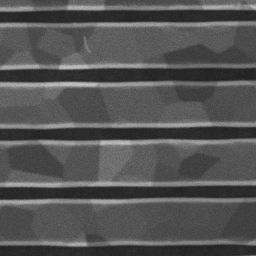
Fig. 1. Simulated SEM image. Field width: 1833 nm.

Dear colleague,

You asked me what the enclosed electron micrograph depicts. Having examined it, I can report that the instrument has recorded wiring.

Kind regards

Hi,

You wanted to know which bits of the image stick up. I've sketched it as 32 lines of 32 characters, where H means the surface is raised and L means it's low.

HHHHHHHHHHHHHHHHHHHHHHHHHHHHHHHH
LLLLLLLLLLLLLLLLLLLLLLLLLLLLLLLL
LLLLLLLLLLLLLLLLLLLLLLLLLLLLLLLL
HHHHHHHHHHHHHHHHHHHHHHHHHHHHHHHH
HHHHHHHHHHHHHHHHHHHHHHHHHHHHHHHH
HHHHHHHHHHHHHHHHHHHHHHHHHHHHHHHH
HHHHHHHHHHHHHHHHHHHHHHHHHHHHHHHH
HHHHHHHHHHHHHHHHHHHHHHHHHHHHHHHH
LLLLLLLLLLLLLLLLLLLLLLLLLLLLLLLL
LLLLLLLLLLLLLLLLLLLLLLLLLLLLLLLL
LLLLLLLLLLLLLLLLHHHHHHHHHHHHHHHH
HHHHHHHHHHHHHHHHHHHHHHHHHHHHHHHH
HHHHHHHHHHHHHHHHHHHHHHHHHHHHHHHH
HHHHHHHHHHHHHHHHHHHHHHHHHHHHHHHH
HHHHHHHHHHHHHHHHHHHHHHHHHHHHHHHH
HHHHHHHHHHHHHHHHHHHHHHHHHHLLHHHH
LLLLLLLLLLLLLLLLLLLLLLLLLLLLLLLL
LLLLLLLLLLLLLLLLLLLLLLLLLLLLLLLL
HHHHHHHHHHHHHHHHHHHHHHHHHHHHHHHH
HHHHHHHHHHHHHHHHHHHHHHHHHHHHHHHH
HHHHHHHHHHHHHHHHHHHHHHHHHHHHHHHH
HHHHHHHHHHHHHHHHHHHHHHHHHHHHHHHH
HHHHHHHHHHHHHHHHHHHHHHHHHHHHHHHH
LLLLLLLLLLLLLLLLLLLLLLLLLLLLLLLL
LLLLLLLLLLLLLLLLLLLLLLLLLLLLLLLL
HHHHHHHHHHHHHHHHHHHHHHHHHHHHHHHH
HHHHHHHHHHHHHHHHHHHHHHHHHHHHHHHH
HHHHHHHHHHHHHHHHHHHHHHHHHHHHHHHH
HHHHHHHHHHHHHHHHHHHHHHHHHHHHHHHH
HHHHHHHHHHHHHHHHHHHHHHHHHHHHHHHH
LLLLLLLHHHHHHHLLLLLLLLLLLLLLLLLL
LLLLLLLLLLLLLLLLLLLLLLLLLLLLLLLL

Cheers